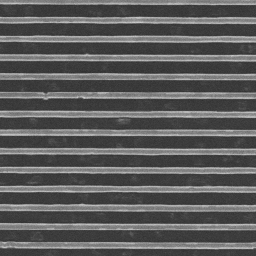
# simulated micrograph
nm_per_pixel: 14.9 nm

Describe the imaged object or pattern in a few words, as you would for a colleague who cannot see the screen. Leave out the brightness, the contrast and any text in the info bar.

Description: parallel lines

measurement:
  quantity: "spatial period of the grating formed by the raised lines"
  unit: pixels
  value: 18.8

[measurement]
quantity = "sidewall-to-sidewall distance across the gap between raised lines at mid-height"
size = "205 nm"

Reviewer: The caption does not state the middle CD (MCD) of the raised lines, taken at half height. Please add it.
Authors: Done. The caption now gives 72.6 nm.